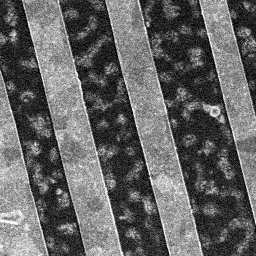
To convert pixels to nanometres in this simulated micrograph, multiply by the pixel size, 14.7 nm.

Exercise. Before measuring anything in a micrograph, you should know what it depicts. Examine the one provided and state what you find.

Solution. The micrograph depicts one or a few lines or trenches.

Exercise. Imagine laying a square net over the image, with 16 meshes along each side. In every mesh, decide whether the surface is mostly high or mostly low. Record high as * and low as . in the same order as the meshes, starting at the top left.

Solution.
..**...**....*..
..**...**....*..
..**...**....**.
..***..***...**.
...**...**....*.
...**...**....**
*..**...**....**
*..***..***...**
*..***...**....*
*...**...**....*
**..**...**....*
**..***..***...*
**..***...**....
**...**...**....
***..**...**....
***..***..***...